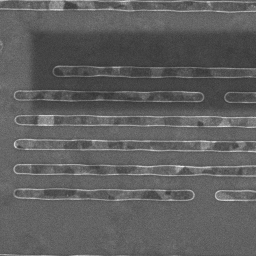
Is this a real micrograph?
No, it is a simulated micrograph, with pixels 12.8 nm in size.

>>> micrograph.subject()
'groups of lines, slits or small figures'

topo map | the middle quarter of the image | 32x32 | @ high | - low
--------------------------------
@@@@@@@@@@@@@@@@@@@@@@@@@@@@@@@@
@@@@@@@@@@@@@@@@@@@@@@@@@@@@@@@@
--------------------------------
--------------------------------
--------------------------------
--------------------------------
@@@@@@@@@@@@@@@@@@@@@@@@@@@@@@@@
@@@@@@@@@@@@@@@@@@@@@@@@@@@@@@@@
--------------------------------
--------------------------------
--------------------------------
--------------------------------
@@@@@@@@@@@@@@@@@@@@@@@@@@@@@@@@
@@@@@@@@@@@@@@@@@@@@@@@@@@@@@@@@
---------------------------@@@@@
--------------------------------
--------------------------------
--------------------------------
@@@@@@@@@@@@@@@@@@@@@@@@@@@@@@@@
@@@@@@@@@@@@@@@@@@@@@@@@@@@@@@@@
----------------------@@@@@@@@@@
--------------------------------
--------------------------------
--------------------------------
@@@@@@@@@@@@@--@@@------@@@@----
@@@@@@@@@@@@@@@@@@@@@@@@@@@@@@@@
-------@@@@@@---@@@@--@@@@@@@@@@
--------------------------------
--------------------------------
--------------------------------
@@------------------------------